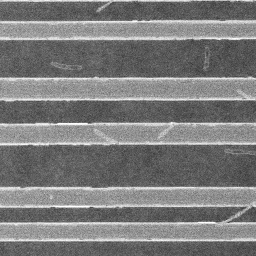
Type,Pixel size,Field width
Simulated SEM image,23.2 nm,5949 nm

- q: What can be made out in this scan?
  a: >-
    lines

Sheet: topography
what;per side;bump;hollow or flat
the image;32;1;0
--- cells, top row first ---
00000000000000000000000000000000
00000000000000000000000000000000
00000000000000000000000000000000
11111111111111111111111111111111
11111111111111111111111111111111
00000000000000000000000000000000
00000000000000000000000000000000
00000000000000000000000000000000
00000000000000000000000000000000
00000000000000000000000000000000
11111111111111111111111111111111
11111111111111111111111111111111
00000000000000000000000000000000
00000000000000000000000000000000
00000000000000000000000000000000
00000000000001000000111110011111
11111111111111111111111111111111
11111111111111111111111111111111
00000000000000000000000000000000
00000000000000000000000000000000
00000000000000000000000000000000
00000000000000000000000000000000
00000000000000000000000000000000
00000101111000111111111111111111
11111111111111111111111111111111
11111111111111111111111111111111
00000000000000000000000000000000
00000000000000000000000000000000
11111111111111111111111111111111
11111111111111111111111111111111
00000000000000000000000000000000
00000000000000000000000000000000